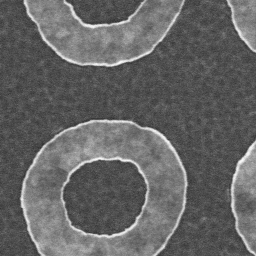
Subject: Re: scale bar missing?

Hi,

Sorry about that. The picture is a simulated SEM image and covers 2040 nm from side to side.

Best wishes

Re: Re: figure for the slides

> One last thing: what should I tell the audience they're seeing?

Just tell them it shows ring-shaped raised bodies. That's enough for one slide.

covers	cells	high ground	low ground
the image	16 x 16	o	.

..oo.....oo...oo
..ooo..oooo....o
...ooooooo.....o
....ooooo.......
................
................
................
................
....oooooo......
...oooooooo....o
..ooo....oo....o
.ooo.....ooo...o
.ooo.....ooo...o
..oo.....oo....o
..ooo...ooo....o
..oooooooo......